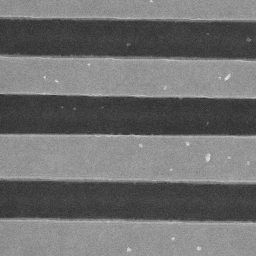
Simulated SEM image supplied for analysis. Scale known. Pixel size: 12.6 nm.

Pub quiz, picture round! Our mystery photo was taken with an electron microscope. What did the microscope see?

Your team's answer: lines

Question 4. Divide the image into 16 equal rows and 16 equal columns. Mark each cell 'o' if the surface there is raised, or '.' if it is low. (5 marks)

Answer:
oooooooooooooooo
................
................
................
oooooooooooooooo
oooooooooooooooo
................
................
ooooooooooo.....
oooooooooooooooo
oooooooooooooooo
................
................
................
oooooooooooooooo
oooooooooooooooo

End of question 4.